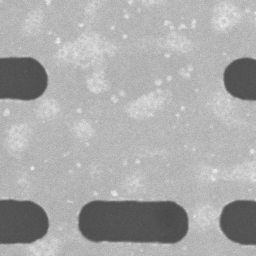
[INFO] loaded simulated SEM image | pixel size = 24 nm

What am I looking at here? holes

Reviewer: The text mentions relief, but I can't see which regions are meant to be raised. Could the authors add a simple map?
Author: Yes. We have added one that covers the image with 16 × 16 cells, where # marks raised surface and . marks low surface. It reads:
################
################
################
################
...###########..
...###########..
################
################
################
################
################
################
.###############
...##.......##..
...##.......##..
################